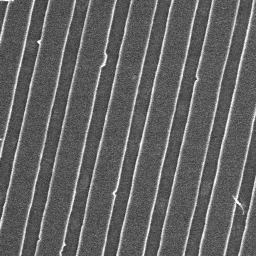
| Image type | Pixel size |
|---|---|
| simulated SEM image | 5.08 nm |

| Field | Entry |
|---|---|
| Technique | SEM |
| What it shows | parallel lines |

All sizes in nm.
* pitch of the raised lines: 203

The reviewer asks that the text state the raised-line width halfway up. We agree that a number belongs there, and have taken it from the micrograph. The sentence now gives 133 nm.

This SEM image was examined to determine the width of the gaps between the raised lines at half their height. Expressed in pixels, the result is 14.1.